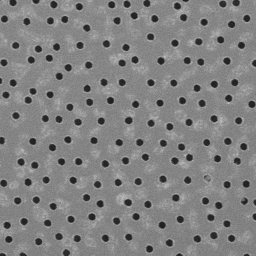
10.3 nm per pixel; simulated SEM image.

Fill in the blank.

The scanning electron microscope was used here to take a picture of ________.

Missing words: a regular array of holes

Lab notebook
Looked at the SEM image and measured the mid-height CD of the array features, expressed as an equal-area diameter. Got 77.7 nm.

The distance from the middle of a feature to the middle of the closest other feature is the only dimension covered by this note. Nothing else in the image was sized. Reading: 178 nanometers